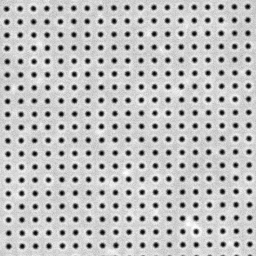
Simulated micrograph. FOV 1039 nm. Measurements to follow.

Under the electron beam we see a regular array of holes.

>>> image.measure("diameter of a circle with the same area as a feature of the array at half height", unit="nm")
24.7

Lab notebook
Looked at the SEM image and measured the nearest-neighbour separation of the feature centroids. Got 52.5 nm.